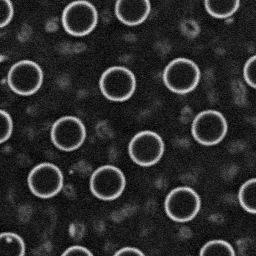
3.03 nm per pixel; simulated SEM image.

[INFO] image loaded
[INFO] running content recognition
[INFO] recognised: a regular array of raised bodies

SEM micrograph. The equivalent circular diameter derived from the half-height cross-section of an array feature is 102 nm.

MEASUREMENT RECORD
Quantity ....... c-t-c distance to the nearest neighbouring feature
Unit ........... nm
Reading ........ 179